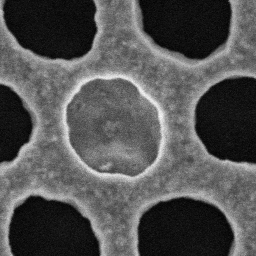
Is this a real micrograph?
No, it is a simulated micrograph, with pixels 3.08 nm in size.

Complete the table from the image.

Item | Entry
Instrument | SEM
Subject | holes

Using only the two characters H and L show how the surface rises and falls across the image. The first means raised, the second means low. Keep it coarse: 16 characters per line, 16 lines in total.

LLLLLLHHHLLLLLHH
LLLLLLHHHLLLLLHH
HLLLLLHHHLLLLLHH
HHLLLHHHHHHLLHHH
HHHHHHHHHHHHHHHH
LHHHHHHHHHHHHLLL
LLHHHHHHHHHHLLLL
LLHHHHHHHHHHLLLL
LLHHHHHHHHHHLLLL
LHHHHHHHHHHHHLLL
HHHHHHHHHHHHHHHH
HHHHHHHHHHHHHHHH
HLLHHHHHHHHLHHHH
HLLLLHHHHLLLLLHH
HLLLLLHHHLLLLLLH
HLLLLLHHHLLLLLLH